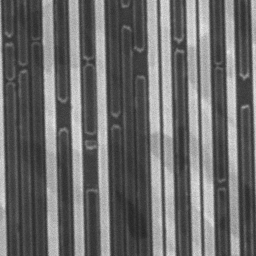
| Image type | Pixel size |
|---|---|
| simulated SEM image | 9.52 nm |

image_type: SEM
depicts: parallel lines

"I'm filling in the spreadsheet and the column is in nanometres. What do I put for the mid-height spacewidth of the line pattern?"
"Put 40.4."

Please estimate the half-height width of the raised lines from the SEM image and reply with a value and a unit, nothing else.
80.9 nanometres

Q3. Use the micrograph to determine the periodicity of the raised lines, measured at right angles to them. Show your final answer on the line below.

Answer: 124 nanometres